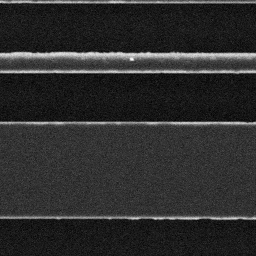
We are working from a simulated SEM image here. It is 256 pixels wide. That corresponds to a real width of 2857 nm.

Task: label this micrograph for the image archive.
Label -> lines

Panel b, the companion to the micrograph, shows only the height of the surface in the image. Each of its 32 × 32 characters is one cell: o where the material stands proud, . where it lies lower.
................................
................................
................................
................................
................................
................................
................................
oooooooooooooooooooooooooooooooo
oooooooooooooooooooooooooooooooo
................................
................................
................................
................................
................................
................................
oooooooooooooooooooooooooooooooo
oooooooooooooooooooooooooooooooo
oooooooooooooooooooooooooooooooo
oooooooooooooooooooooooooooooooo
oooooooooooooooooooooooooooooooo
oooooooooooooooooooooooooooooooo
oooooooooooooooooooooooooooooooo
oooooooooooooooooooooooooooooooo
oooooooooooooooooooooooooooooooo
oooooooooooooooooooooooooooooooo
oooooooooooooooooooooooooooooooo
oooooooooooooooooooooooooooooooo
................................
................................
................................
................................
................................